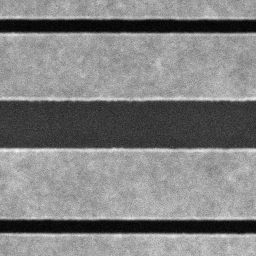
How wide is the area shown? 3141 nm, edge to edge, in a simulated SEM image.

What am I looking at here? lines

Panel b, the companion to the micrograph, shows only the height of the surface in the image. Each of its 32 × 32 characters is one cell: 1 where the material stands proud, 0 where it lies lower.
11111111111111111111111111111111
11111111111111111111111111111111
00000000000000000000000000000000
00000000000000000000000000000000
11111111111111111111111111111111
11111111111111111111111111111111
11111111111111111111111111111111
11111111111111111111111111111111
11111111111111111111111111111111
11111111111111111111111111111111
11111111111111111111111111111111
11111111111111111111111111111111
00000000001100000100000000000000
00000000000000000000000000000000
00000000000000000000000000000000
00000000000000000000000000000000
00000000000000000000000000000000
00000000000000000000000000000000
00000000000000000000000000000000
11111111111111111111111111111111
11111111111111111111111111111111
11111111111111111111111111111111
11111111111111111111111111111111
11111111111111111111111111111111
11111111111111111111111111111111
11111111111111111111111111111111
11111111111111111111111111111111
00000000000000000000000000000000
00000000000000000000000000000000
11111111111111111111111111111111
11111111111111111111111111111111
11111111111111111111111111111111